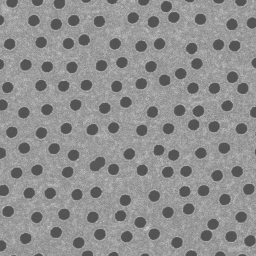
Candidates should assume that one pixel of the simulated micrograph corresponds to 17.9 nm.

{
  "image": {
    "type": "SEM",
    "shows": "a regular array of holes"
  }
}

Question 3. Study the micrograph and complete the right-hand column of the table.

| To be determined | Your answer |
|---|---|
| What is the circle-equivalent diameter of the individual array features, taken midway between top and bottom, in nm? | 204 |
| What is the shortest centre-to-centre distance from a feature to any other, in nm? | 357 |